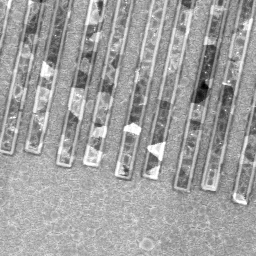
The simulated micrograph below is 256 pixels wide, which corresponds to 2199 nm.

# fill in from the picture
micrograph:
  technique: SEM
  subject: parallel lines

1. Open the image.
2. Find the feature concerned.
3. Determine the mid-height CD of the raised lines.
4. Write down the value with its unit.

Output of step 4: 109 nanometers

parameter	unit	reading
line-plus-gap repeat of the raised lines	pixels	29.5